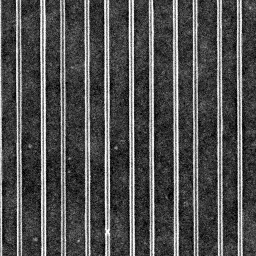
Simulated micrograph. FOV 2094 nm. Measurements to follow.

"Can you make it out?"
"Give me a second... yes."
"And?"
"parallel lines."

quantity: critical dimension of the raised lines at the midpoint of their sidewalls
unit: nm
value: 31.7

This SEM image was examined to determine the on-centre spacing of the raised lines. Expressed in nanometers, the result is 180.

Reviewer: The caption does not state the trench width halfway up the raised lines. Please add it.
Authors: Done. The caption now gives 0.135 micrometres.